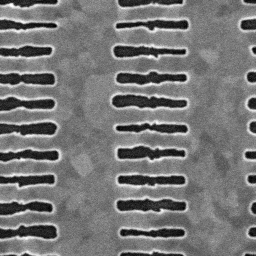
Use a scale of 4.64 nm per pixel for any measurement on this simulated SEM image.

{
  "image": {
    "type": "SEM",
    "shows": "a regular array of holes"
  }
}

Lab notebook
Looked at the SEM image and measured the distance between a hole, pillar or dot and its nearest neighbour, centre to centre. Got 119 nm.